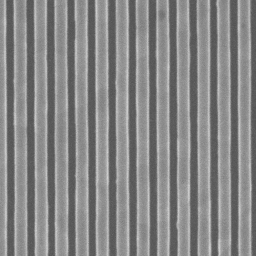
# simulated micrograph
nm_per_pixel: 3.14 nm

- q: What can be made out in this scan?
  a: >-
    parallel lines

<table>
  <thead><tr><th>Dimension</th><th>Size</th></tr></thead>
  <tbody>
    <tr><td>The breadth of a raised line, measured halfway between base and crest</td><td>36.1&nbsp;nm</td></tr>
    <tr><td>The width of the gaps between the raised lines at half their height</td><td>27.4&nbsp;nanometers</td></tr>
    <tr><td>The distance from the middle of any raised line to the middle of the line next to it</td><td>63.8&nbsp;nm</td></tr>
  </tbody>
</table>